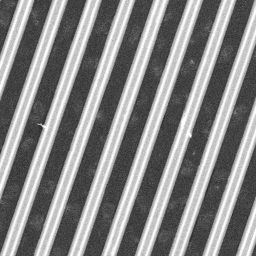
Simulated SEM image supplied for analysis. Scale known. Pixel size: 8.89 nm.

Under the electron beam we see parallel lines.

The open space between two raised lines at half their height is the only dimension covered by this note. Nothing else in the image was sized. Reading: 186 nm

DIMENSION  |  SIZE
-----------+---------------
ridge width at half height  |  0.0968 microns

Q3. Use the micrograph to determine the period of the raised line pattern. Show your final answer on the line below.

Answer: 284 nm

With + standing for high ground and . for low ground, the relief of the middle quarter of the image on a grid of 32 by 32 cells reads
+++......+++.....+++......+++...
+++......++......+++......++....
+++.....+++......+++.....+++....
++......+++.....+++......+++....
++......++......+++......++.....
++.....+++......+++.....+++.....
+......+++.....+++......+++.....
+......++......+++......++......
+.....+++......+++.....+++......
......+++.....+++......+++.....+
......++......+++......++......+
.....+++......++......+++......+
.....+++.....+++......+++.....++
.....++......+++.....+++......++
....+++......++......+++.....+++
....+++.....+++......+++.....+++
...+++......+++.....+++......+++
...+++......++......+++......+++
...+++.....+++......+++.....+++.
..+++......+++.....+++......+++.
..+++......++......+++......++..
..+++.....+++......+++.....+++..
.+++......+++.....+++......+++..
.+++......+++.....+++......++...
.+++.....+++......+++.....+++...
+++......+++.....+++......+++...
+++......++......+++......++....
+++.....+++......+++.....+++....
++......+++.....+++......+++....
++......++......+++.....+++.....
++.....+++......+++.....+++.....
+......+++.....+++......+++.....